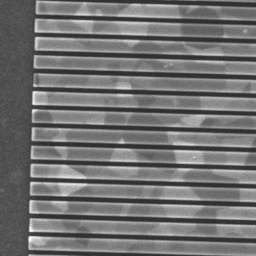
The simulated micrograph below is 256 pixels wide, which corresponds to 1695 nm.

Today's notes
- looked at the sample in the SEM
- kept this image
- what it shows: parallel lines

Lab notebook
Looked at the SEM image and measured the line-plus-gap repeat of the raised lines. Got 120 nanometers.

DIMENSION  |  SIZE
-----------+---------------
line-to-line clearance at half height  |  39.7 nm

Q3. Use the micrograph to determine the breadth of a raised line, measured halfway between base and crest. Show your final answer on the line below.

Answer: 79.4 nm